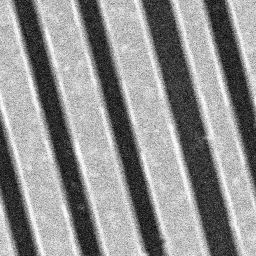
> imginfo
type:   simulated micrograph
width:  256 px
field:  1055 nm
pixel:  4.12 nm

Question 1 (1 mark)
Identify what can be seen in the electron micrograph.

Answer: parallel lines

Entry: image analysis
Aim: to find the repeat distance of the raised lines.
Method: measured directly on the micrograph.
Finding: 260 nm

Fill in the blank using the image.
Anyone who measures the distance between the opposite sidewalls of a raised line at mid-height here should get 158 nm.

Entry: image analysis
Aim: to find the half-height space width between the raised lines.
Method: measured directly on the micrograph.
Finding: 96.5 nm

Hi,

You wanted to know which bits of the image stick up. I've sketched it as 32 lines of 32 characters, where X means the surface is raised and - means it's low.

X----XXXX----XXXX-----XXX----XXX
XX---XXXXX---XXXXX----XXXX---XXX
XX---XXXXX---XXXXX----XXXX---XXX
XX---XXXXX---XXXXX----XXXX---XXX
XXX---XXXXX---XXXXX----XXX----XX
XXX---XXXXX---XXXXX----XXXX---XX
XXX---XXXXX---XXXXX----XXXX---XX
XXX---XXXXX---XXXXX-----XXX---XX
XXXX---XXXXX---XXXXX----XXX----X
XXXX---XXXXX---XXXXX----XXXX---X
XXXX---XXXXX---XXXXX----XXXX---X
XXXX---XXXXX---XXXXX-----XXX----
XXXXX---XXXXX---XXXXX----XXXX---
XXXXX---XXXXX---XXXXX----XXXX---
XXXXX---XXXXX---XXXXX----XXXX---
-XXXXX---XXXX----XXXX-----XXX---
-XXXXX---XXXXX---XXXXX----XXXX--
-XXXXX---XXXXX---XXXXX----XXXX--
-XXXXX---XXXXX---XXXXX-----XXX--
--XXXXX---XXXXX---XXXXX----XXX--
--XXXXX---XXXXX---XXXXX----XXXX-
--XXXXX---XXXXX---XXXXX----XXXX-
--XXXXX---XXXXX---XXXXX-----XXX-
---XXXXX---XXXXX---XXXXX----XXXX
---XXXXX---XXXXX---XXXXX----XXXX
---XXXXX---XXXXX---XXXXX----XXXX
----XXXX----XXXX----XXXX-----XXX
X---XXXXX---XXXXX---XXXXX----XXX
X---XXXXX---XXXXX---XXXXX----XXX
X---XXXXX---XXXXX---XXXXX----XXX
XX---XXXXX---XXXXX---XXXXX----XX
XX---XXXXX---XXXXX---XXXXX----XX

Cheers